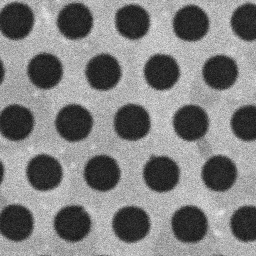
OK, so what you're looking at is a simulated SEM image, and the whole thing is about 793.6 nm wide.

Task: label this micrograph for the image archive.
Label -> a regular array of holes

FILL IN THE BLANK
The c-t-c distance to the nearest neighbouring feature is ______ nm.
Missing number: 179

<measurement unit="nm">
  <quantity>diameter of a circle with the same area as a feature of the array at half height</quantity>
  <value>120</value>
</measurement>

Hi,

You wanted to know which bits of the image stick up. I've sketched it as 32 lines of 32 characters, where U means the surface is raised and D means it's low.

UDDUUUUUDDDUUUUUDUUUUUUUUUUUUUDD
DDDDUUUDDDDUUUDDDDDUUUDDDDUUUDDD
DDDDUUUDDDDDUUDDDDDUUUDDDDUUUDDD
DDDDUUUDDDDDUUDDDDDUUUDDDDUUUDDD
DDDUUUUUDDDUUUUDDDUUUUDDDDUUUDDD
UUUUUUUUUUUUUUUUUUUUUUUUUUUUUUUU
UUUUUDUUUUUUUUUUUUUUUUUUUUUUUUUU
UUUUDDDDUUUDDDDUUUDDDDUUUUDDDUUU
DUUDDDDDUUUDDDDUUUDDDDUUUDDDDDUU
DUUDDDDDUUUDDDDUUUDDDDDUUDDDDDUU
UUUUDDDUUUUDDDDUUUDDDDUUUUDDDUUU
UUUUUUUUUUUUUUUUUUUUUUUUUUUUUUUU
UUUUUUUUUUUUUUUUUUUUUUUUUUUUUUUU
DDDUUUUUDDDUUUUDDDUUUUDDDUUUUUDD
DDDDUUUDDDDDUUDDDDDUUUDDDDUUUDDD
DDDDUUUDDDDDUUDDDDDUUUDDDDUUUDDD
DDDDUUUDDDDUUUDDDDDUUUDDDDUUUDDD
UDDUUUUUDDUUUUUUDDUUUUUDDDUUUUDD
UUUUUUUUUUUUUUUUUUUUUUUUUDUUUUUU
UUUUDDDUUUUUDDUUUUUDDUUUUDDDUUUU
UUUDDDDDUUUDDDDUUUDDDDUUUDDDDUUU
DUUDDDDDUUDDDDDUUUDDDDDUUDDDDDUU
UUUDDDDDUUUDDDDUUUDDDDDUUDDDDDUU
UUUUDDDUUUUDDDUUUUDDDDUUUUDDDUUU
UUUUUUUUUUUUUUUUUUUUUUUUUUUUUUUU
UDUUUUUUUUUUUUUUUUUUUUUUUUUUUUUU
DDDDUUUDDDDUUUDDDDUUUUDDDDUUUDDD
DDDDUUUDDDDUUUDDDDDUUDDDDDUUUDDD
DDDDUUUDDDDUUUDDDDDUUDDDDDUUUDDD
DDDDUUUDDDDUUUDDDDUUUUDDDDUUUDDD
UUUUUUUUUUUUUUUUDUUUUUUUUUUUUUUU
UUUUUUUUUUUUUUUUUUUUUUUUUUUUUUUU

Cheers